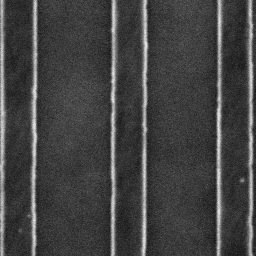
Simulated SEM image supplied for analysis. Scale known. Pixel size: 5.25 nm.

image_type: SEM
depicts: lines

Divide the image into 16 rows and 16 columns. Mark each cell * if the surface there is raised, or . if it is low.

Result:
**.....**.....**
**.....**.....**
**.....**.....**
**.....**.....**
**.....**.....**
**.....**.....**
**.....**.....**
**.....**.....**
**.....**.....**
**.....**.....**
**.....**.....**
**.....**.....**
**.....**.....**
**.....**.....**
**.....**.....**
**.....**.....**